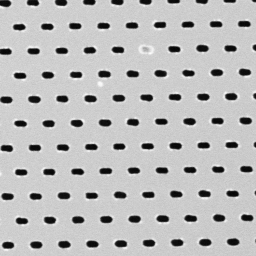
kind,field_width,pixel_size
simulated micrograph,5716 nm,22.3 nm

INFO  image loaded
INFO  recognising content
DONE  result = a regular array of holes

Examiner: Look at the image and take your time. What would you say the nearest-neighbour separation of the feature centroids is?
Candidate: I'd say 619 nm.